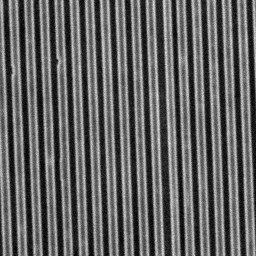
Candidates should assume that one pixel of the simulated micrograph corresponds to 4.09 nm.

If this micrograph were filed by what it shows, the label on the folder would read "parallel lines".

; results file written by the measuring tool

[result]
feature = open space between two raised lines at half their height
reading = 31.2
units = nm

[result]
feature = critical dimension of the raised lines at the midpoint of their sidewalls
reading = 31.2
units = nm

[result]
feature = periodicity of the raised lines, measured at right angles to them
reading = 62.2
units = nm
